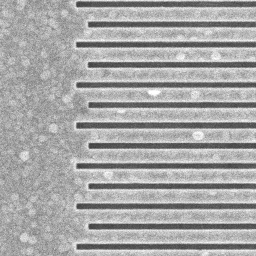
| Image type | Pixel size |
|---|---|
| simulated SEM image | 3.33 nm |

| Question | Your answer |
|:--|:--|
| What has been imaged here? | parallel lines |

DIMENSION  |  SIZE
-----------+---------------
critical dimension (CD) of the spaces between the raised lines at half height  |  18.7 nanometers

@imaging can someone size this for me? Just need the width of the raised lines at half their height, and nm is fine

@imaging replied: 46.6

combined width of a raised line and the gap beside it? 0.0673 µm